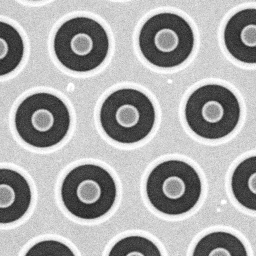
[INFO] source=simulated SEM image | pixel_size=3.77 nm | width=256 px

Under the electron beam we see an array of small figures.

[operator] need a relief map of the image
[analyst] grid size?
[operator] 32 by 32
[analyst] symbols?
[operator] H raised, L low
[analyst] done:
HHHHHHHHHHHHHHHHHHHHHHHHHHHHHHHH
HHHHHHHHHHHHHHHHHHHLLLHHHHHHHLLL
LHHHHHHHLLLLHHHHHHLLLLLLHHHHLLLL
LLHHHHHLLLLLLHHHHLLLLLLLHHHHLLLL
LLLHHHHLLLHLLLHHHLLLHHLLHHHHLLLL
HLLHHHLLLHHLLLHHHLLLHHLLLHHHLLLL
HLLHHHHLLLHLLLHHHLLLLLLLHHHHLLLL
LLLHHHHLLLLLLHHHHHLLLLLLHHHHHLLL
LLHHHHHHLLLLHHHHHHHLLLHHHHHHHHHH
LHHHHHHHHHHHHHHHHHHHHHHHHHHHHHHH
HHHHHHHHHHHHHHHHHHHHHHHHHLLLHHHH
HHHHLLLHHHHHHHLLLLHHHHHHLLLLLHHH
HHHLLLLLHHHHHLLLLLLHHHHLLLLLLLHH
HHLLLLLLLHHHLLLHHLLLHHHLLLHHLLHH
HHLLHHLLLHHHLLLHHLLLHHHLLLHHLLHH
HHLLHHLLLHHHLLLHHLLLHHHLLLLLLLHH
HHLLLLLLLHHHHLLLLLLHHHHHLLLLLHHH
HHLLLLLLHHHHHHLLLLHHHHHHHLLLHHHH
HHHHLLLHHHHHHHHHHHHHHHHHHHHHHHHH
HHHHHHHHHHHHHHHHHHHHHHHHHHHHHHHL
HHHHHHHHHHLLLHHHHHHLLLLLHHHHHLLL
LLLHHHHHLLLLLLHHHHHLLLLLLHHHHLLL
LLLLHHHHLLLLLLHHHHLLLHLLLHHHHLLH
HLLLHHHLLLHHLLLHHHLLHHHLLHHHHLLH
HHLLHHHLLLHHLLLHHHLLLHLLLHHHHLLL
HLLLHHHHLLLLLLLHHHHLLLLLLHHHHHLL
LLLLHHHHLLLLLLHHHHHHLLLLHHHHHHHL
LLLHHHHHHHLLHHHHHHHHHHHHHHHHHHHH
HHHHHHHHHHHHHHHHHHHHHHHHHHHHHHHH
HHHHHHHHHHHHHHHLLLHHHHHHHLLLLLHH
HHHHLLLLLHHHHHLLLLLLHHHHLLLLLLLH
HHHLLLLLLHHHHLLLLLLLHHHHLLLHLLLH